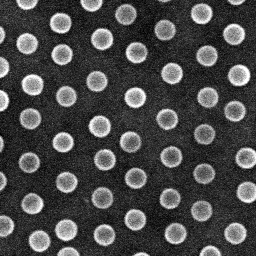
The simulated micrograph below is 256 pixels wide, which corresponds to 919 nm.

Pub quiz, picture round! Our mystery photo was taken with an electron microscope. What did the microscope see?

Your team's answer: a regular array of raised bodies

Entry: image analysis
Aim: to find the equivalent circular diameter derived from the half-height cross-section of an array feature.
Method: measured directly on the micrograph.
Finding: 0.0714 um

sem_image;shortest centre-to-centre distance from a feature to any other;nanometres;124